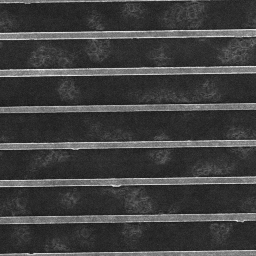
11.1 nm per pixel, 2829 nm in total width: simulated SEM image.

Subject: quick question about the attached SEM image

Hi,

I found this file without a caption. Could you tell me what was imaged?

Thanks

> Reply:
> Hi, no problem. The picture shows parallel lines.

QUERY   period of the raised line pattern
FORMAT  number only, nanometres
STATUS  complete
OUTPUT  407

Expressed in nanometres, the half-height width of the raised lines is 69.1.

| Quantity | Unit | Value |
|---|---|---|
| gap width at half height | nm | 336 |